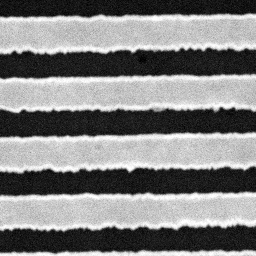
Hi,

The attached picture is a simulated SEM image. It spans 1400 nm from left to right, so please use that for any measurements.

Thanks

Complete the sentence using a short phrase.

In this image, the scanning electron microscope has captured lines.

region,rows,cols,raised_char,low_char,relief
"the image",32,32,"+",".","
................................
................................
++++++++++++++++++++++++++++++++
++++++++++++++++++++++++++++++++
++++++++++++++++++++++++++++++++
++++++++++++++++++++++++++++++++
+...+++.........................
................................
................................
......................+....+++++
++++++++++++++++++++++++++++++++
++++++++++++++++++++++++++++++++
++++++++++++++++++++++++++++++++
+++++++++++++++++++..+++++..++++
................................
................................
................................
++++++++++++++++++++++++++++++++
++++++++++++++++++++++++++++++++
++++++++++++++++++++++++++++++++
++++++++++++++++++++++++++++++++
..+.............................
................................
................................
......++.+++++++.+++++++++++++++
++++++++++++++++++++++++++++++++
++++++++++++++++++++++++++++++++
++++++++++++++++++++++++++++++++
++..+++++..++......+............
................................
................................
.................+....+...++..++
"